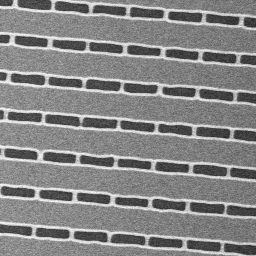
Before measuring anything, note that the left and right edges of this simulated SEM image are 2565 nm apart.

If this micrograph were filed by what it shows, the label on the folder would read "an array of small figures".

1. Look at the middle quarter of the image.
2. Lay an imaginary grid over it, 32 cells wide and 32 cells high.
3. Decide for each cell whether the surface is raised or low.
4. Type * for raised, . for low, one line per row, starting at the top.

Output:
********************************
********************************
********************************
...****.************************
.................***************
........................*.**.***
******..........................
****************.......*........
*******************************.
********************************
********************************
********************************
********************************
..........**.*******************
......................**********
................................
************.*..................
************************.**.....
********************************
********************************
********************************
********************************
...*****************************
.............*.*****************
......................*....*****
*******.........................
********************............
*****************************..*
********************************
********************************
********************************
********************************